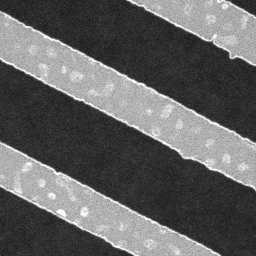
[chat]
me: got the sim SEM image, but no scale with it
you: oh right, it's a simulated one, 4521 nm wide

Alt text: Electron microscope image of one or a few lines or trenches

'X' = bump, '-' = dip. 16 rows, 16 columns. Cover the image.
XXXXXXXXX------X
-XXXXXXXXXX-----
---XXXXXXXXXX---
-----XXXXXXXXXX-
XX-----XXXXXXXXX
XXXX-----XXXXXXX
XXXXXX-----XXXXX
XXXXXXXX-----XXX
XXXXXXXXX------X
-XXXXXXXXXX-----
---XXXXXXXXXX---
-----XXXXXXXXXX-
XX-----XXXXXXXXX
XXXX-----XXXXXXX
XXXXXX-----XXXXX
XXXXXXXX-----XXX